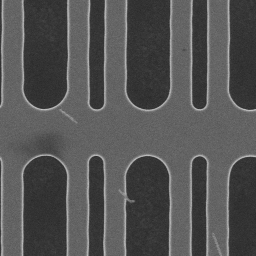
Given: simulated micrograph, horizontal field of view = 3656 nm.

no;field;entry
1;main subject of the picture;groups of lines, slits or small figures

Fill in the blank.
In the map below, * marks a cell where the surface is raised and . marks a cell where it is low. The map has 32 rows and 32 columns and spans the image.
***.....***..***.....***..***...
***.....***..***.....***..***...
***......**..***.....***..***...
***......**..***.....***..***...
***.....***..***.....***..***...
***.....***..***.....***..***...
***......**..***.....***..***...
***.....***..***.....***..***...
***.....***..***.....***..***...
***.....***..***.....***..***...
***.....***..***.....***..***...
***.....***..***.....***..***...
***.....***..***.....***..***...
*****.******.****..***********..
********************************
********************************
********************************
********************************
********************************
*****.************.*************
****....***..***....****..***...
***.....***..***.....***..***...
***.....***..***.....***..***...
***.....***..***.....***..**....
***.....***..***.....***..**....
***.....***..***.....***..**....
***.....***..***.....***..**....
***.....***..***.....***..**....
***.....***..***.....***..**....
***.....***..***.....***..**....
***.....***..***.....***..**....
***.....***..***.....***..**....